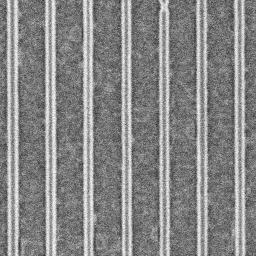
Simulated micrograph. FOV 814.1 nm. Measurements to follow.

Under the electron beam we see parallel lines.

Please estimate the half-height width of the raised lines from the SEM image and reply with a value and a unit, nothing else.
0.025 micrometres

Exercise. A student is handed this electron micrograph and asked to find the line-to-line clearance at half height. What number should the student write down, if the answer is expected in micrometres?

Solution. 0.097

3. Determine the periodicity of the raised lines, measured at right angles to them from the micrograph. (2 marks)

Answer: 120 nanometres